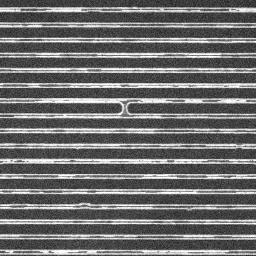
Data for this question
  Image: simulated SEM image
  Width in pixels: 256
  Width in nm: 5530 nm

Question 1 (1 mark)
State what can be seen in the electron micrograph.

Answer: parallel lines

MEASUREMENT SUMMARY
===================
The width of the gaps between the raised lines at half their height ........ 0.248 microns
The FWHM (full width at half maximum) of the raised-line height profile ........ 81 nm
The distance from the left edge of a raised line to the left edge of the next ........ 0.327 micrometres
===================